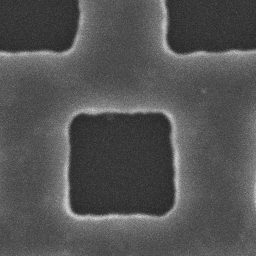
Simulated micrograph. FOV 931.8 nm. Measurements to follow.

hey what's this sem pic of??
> holes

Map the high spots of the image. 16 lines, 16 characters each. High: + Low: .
.....+++++......
.....+++++......
.....+++++......
++++++++++++++++
++++++++++++++++
++++++++++++++++
++++++++++++++++
+++++......+++++
++++.......+++++
++++.......+++++
++++.......+++++
++++.......+++++
++++.......+++++
+++++.+++.++++++
++++++++++++++++
++++++++++++++++